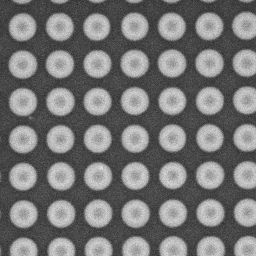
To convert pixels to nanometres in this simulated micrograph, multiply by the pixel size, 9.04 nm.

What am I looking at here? an array of small figures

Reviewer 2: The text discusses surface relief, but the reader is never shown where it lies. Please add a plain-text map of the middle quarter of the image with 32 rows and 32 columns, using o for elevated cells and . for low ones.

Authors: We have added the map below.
oo...ooooooo..ooooooo...oooooo..
oo...oooooo....oooooo...oooooo..
o.....ooooo....ooooo.....oooo...
................................
................................
................................
o......ooo......oooo.....oooo...
oo....ooooo....oooooo...oooooo..
oo...ooooooo..ooooooo...oooooo..
ooo..ooooooo..ooooooo...oooooo..
oo...ooooooo...oooooo...oooooo..
oo....ooooo....ooooo....oooooo..
o......ooo.......oo.......oo....
................................
................................
.......ooo.......oo.......ooo...
oo....ooooo....ooooo....oooooo..
oo...ooooooo...oooooo...oooooo..
oo...ooooooo..ooooooo...oooooo..
oo...ooooooo...oooooo...oooooo..
oo....ooooo....oooooo...oooooo..
o.....oooo......oooo......ooo...
................................
................................
................................
o.....ooooo.....oooo.....ooooo..
oo....oooooo...oooooo...oooooo..
ooo..ooooooo...oooooo...oooooo..
ooo..ooooooo...oooooo...oooooo..
oo...ooooooo...oooooo...oooooo..
oo....ooooo.....oooo.....oooo...
................................